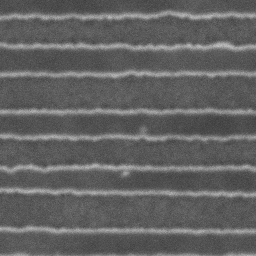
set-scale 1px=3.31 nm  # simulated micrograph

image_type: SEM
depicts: lines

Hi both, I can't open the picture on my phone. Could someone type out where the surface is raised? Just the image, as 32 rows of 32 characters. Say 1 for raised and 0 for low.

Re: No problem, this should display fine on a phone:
11111111111111111111111111111111
11111111111111111111111111111111
00000000000000000000000000000000
00000000000000000000000000000000
00000000000000000000000000000000
10000000000000000000000000000000
11111111111111111111111111111111
11111111111111111111111111111111
11111111111111111111111111111111
11000011011011100001000000100001
00000000000000000000000000000000
00000000000000000000000000000000
00000000000000000000000000000000
00000000000000000000000000000000
11111111111111111111111111111111
11111111111111111111111111111111
11111111111111111111111111111111
00000000000000000000000001010000
00000000000000000000000000000000
00000000000000000000000000000000
00000000000000000000000000000000
11111111111111111111111111111111
11111111111111111111111111111111
11111111111111111111111111111111
00000000000000000000000000000011
00000000000000000000000000000000
00000000000000000000000000000000
00000000000000000000000000000000
10011100000000000000000000000000
11111111111111111111111111111111
11111111111111111111111111111111
11111111111111111111111111111111